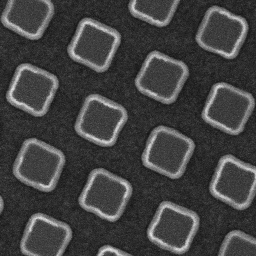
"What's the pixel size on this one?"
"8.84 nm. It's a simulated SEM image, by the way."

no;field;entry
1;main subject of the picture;a regular array of raised bodies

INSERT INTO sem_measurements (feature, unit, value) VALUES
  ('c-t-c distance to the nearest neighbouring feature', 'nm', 654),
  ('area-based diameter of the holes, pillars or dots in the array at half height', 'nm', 405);